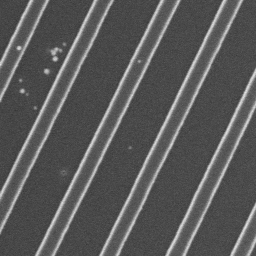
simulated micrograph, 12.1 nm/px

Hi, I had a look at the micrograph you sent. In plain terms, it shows lines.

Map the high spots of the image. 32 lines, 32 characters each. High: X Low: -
----XX------XX------XX------XX--
---XX------XX------XXX-----XXX--
---XX------XX------XX------XX---
--XX------XX------XXX-----XXX---
--XX------XX------XX------XX----
-XX------XX------XXX-----XXX----
-XX------XX------XX------XX-----
XX------XX------XXX-----XXX-----
XX------XX------XX------XX------
X------XX-------XX-----XXX------
X------XX------XX------XX------X
X-----XXX------XX-----XXX------X
------XX------XX------XX------XX
-----XXX------XX-----XXX------XX
-----XX------XX------XX------XX-
----XXX------XX------XX------XX-
----XX------XX------XX------XX--
---XXX------XX-----XXX------XX--
---XX------XX------XX------XX---
--XXX------XX------XX------XX---
--XX------XX------XX------XXX---
-XXX------XX------XX------XX----
-XX------XX------XX------XXX----
XXX------XX------XX------XX-----
XX------XX------XX------XXX-----
XX------XX------XX------XX------
X------XX------XX------XXX-----X
X------XX------XX------XX------X
------XX------XX------XXX------X
------XX------XX------XX------XX
-----XX------XX-------XX------XX
-----XX------XX------XX------XX-